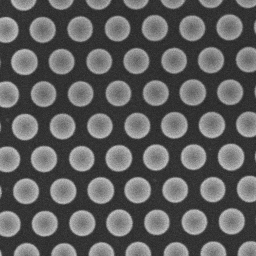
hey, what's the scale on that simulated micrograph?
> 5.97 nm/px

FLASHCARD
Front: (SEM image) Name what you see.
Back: an array of small figures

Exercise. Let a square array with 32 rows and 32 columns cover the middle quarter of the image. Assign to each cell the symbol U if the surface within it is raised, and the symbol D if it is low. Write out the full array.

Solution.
UUDDDDUUUUUUDDDUUUUUUDDDDUUUUUDD
UUDDDDUUUUUDDDDDUUUUUDDDDUUUUUDD
DDDDDDDDDDDDDDDDDUUDDDDDDDDDDDDD
DDDDDDDDDDDDDDDDDDDDDDDDDDDDDDDD
DDDUUDDDDDDDUUUDDDDDDUUUDDDDDDUU
DDUUUUUDDDDUUUUUDDDDUUUUUUDDDUUU
DUUUUUUDDDDUUUUUUDDDUUUUUUDDDUUU
DUUUUUUDDDDUUUUUUDDDUUUUUUDDDUUU
DUUUUUUDDDDUUUUUUDDDUUUUUUDDDUUU
DDUUUUUDDDDUUUUUDDDDDUUUUDDDDDUU
DDDUUDDDDDDDDDDDDDDDDDDDDDDDDDDD
DDDDDDDDDDDDDDDDDDDDDDDDDDDDDDDD
DDDDDDDDUUDDDDDDDUUDDDDDDDUUUDDD
UUDDDDDUUUUDDDDDUUUUUDDDDUUUUUDD
UUUDDDUUUUUUDDDUUUUUUDDDUUUUUUUD
UUUDDDUUUUUUDDDUUUUUUDDDUUUUUUUD
UUUDDDUUUUUUDDDUUUUUUDDDDUUUUUUD
UUDDDDDUUUUDDDDDUUUUUDDDDUUUUUDD
UDDDDDDDUUDDDDDDDUUDDDDDDDDUDDDD
DDDDDDDDDDDDDDDDDDDDDDDDDDDDDDDD
DDDDDDDDDDDDUUUDDDDDDDUUUDDDDDDU
DDUUUUUDDDDUUUUUDDDDDUUUUUDDDDUU
DDUUUUUDDDDUUUUUUDDDUUUUUUDDDUUU
DUUUUUUDDDDUUUUUUDDDUUUUUUDDDUUU
DUUUUUUDDDDUUUUUUDDDUUUUUUDDDUUU
DDUUUUUDDDDUUUUUDDDDDUUUUUDDDDUU
DDDUUUDDDDDDUUUDDDDDDDUUDDDDDDDD
DDDDDDDDDDDDDDDDDDDDDDDDDDDDDDDD
DDDDDDDDUUDDDDDDDDUDDDDDDDDUUDDD
UUDDDDDUUUUUDDDDUUUUUDDDDUUUUUDD
UUUDDDUUUUUUDDDUUUUUUUDDDUUUUUUD
UUUDDDUUUUUUUDDUUUUUUUDDDUUUUUUD